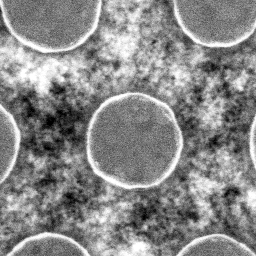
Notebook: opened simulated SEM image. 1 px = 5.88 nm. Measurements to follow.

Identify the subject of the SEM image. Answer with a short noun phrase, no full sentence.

raised bodies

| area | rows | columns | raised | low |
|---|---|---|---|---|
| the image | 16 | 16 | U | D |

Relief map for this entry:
UUUUUUDDDDDUUUUU
UUUUUUDDDDDUUUUU
DUUUUDDDDDDDUUUD
DDDDDDDDDDDDDDDD
DDDDDDDDDDDDDDDD
DDDDDDDDDDDDDDDD
DDDDDDDUUUDDDDDD
UDDDDDUUUUUDDDDD
UDDDDDUUUUUDDDDD
UDDDDDUUUUUDDDDD
UDDDDDUUUUUDDDDD
DDDDDDDUUUDDDDDD
DDDDDDDDDDDDDDDD
DDDDDDDDDDDDDDDD
DDDDDDDDDDDDDDDD
DUUUUDDDDDDDUUUD